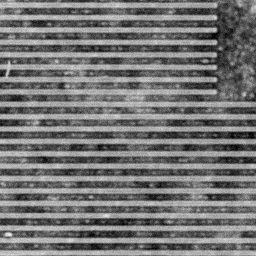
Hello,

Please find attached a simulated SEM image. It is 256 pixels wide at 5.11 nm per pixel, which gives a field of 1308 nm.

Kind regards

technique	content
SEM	parallel lines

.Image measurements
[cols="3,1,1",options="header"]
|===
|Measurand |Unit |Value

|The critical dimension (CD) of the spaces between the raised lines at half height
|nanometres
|40.8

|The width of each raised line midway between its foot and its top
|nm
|24.3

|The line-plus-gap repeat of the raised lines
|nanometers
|63.2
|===